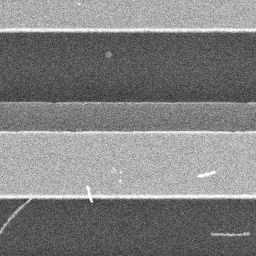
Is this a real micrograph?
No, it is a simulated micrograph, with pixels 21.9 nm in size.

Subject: lines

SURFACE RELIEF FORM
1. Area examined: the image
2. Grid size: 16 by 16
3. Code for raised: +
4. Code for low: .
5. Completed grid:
++++++++++++++++
++++++++++++++++
................
................
................
................
++++++++++++++++
++++++++++++++++
++++++++++++++++
++++++++++++++++
++++++++++++++++
++++++++++++++++
................
................
................
................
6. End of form